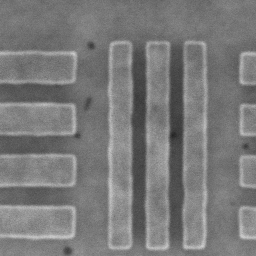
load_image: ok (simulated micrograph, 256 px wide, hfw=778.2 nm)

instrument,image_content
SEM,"groups of lines, slits or small figures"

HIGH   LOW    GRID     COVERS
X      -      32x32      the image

--------------------------------
--------------------------------
--------------------------------
--------------------------------
--------------------------------
--------------XX---XX--XX-------
---XX---------XX--XXX--XXX------
XXXXXXXXX-----XX--XXX--XXX----XX
XXXXXXXXX-----XX--XXX--XXX----XX
XXXXXXXXX-----XX--XXX--XXX----XX
--------------XX--XXX--XXX------
--------------XX--XXX--XXX------
--------------XX--XXX--XXX------
XXXXXXXXX-----XX--XXX--XXX----XX
XXXXXXXXX-----XX--XXX--XXX----XX
XXXXXXXXX-----XX--XXX--XXX----XX
XXXXXXXXX-----XX--XXX--XXX----XX
--------------XX--XXX--XXX------
--------------XX--XXX--XXX------
XXXXXXXXX-----XX--XXX--XXX------
XXXXXXXXX-----XX--XXX--XXX----XX
XXXXXXXXX-----XX--XXX--XXX----XX
XXXXXXXXX-----XX--XXX--XXX----XX
--------------XX--XXX--XXX------
--------------XX--XXX--XXX------
--------------XX--XXX--XXX------
XXXXXXXXX-----XX--XXX--XXX----XX
XXXXXXXXX-----XX--XXX--XXX----XX
XXXXXXXXX-----XX--XXX--XXX----XX
-XXXXXXXX-----XX--XXX--XXX----XX
--------------XX--XXX--XXX------
--------------------------------